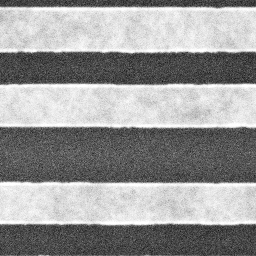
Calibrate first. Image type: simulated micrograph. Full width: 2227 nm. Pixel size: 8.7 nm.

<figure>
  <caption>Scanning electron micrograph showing lines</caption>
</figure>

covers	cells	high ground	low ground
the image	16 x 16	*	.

................
****************
****************
................
................
****************
****************
****************
................
................
................
****************
****************
****************
................
................